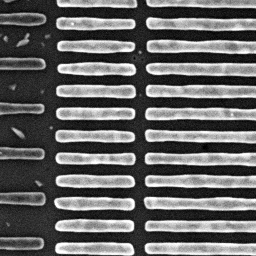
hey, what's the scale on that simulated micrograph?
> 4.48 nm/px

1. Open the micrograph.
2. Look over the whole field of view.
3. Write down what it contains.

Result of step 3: wiring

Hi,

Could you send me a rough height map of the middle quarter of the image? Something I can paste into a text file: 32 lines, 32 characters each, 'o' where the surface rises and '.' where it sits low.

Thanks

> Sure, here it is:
ooooooooooooooooo....ooooooooooo
oooooooooooooooooo...ooooooooooo
....oooooo....ooo.............oo
................................
................................
ooooooooooo...ooo....ooooo....oo
oooooooooooooooooo...ooooooooooo
oooooooooooooooooo...ooooooooooo
................................
................................
................................
ooooooooooooooooo....ooooooooooo
oooooooooooooooooo..oooooooooooo
ooooooooooooooooo...oooooooooooo
................................
................................
................................
oooooooooooooooooo..oooooooooooo
oooooooooooooooooo..oooooooooooo
................................
................................
................................
ooooo.........ooo....ooooo......
oooooooooooooooooo..oooooooooooo
oooooooooooooooooo..oooooooooooo
................................
................................
................................
ooooooooooooooooo...oooooooooooo
oooooooooooooooooo..oooooooooooo
ooooooooooooooooo....ooooooooooo
................................